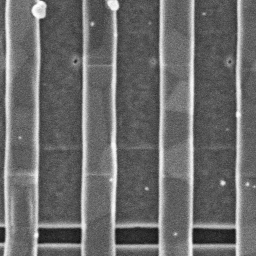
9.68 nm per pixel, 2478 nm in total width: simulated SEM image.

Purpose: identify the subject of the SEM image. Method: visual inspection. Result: wiring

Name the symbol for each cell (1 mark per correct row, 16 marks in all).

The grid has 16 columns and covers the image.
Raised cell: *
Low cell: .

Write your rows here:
***..**...**...*
**...**...**...*
**...**...**...*
**...**...**...*
**...**...**...*
**...**...**...*
**...**...**...*
**...**...**...*
**...**...**...*
**...**...**...*
**...**...**...*
**...**...**...*
**...**...**...*
**...**...**...*
**...**...**...*
**...**...**...*